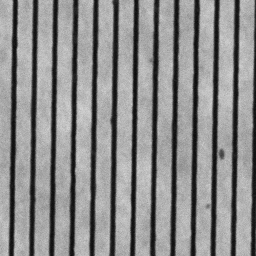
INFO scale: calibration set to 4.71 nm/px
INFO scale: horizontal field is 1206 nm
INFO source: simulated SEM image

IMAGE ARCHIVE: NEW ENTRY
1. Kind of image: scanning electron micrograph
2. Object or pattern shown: parallel lines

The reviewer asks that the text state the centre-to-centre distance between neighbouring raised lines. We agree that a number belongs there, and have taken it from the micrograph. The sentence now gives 0.095 microns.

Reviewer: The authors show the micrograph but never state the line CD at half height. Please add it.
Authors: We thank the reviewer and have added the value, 70.7 nm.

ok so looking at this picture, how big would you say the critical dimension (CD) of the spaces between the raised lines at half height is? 23.6 nm